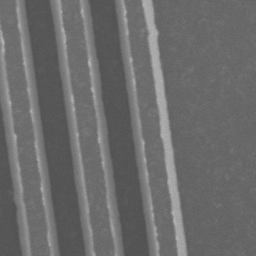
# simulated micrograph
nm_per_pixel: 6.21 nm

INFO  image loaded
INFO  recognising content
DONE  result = one or a few lines or trenches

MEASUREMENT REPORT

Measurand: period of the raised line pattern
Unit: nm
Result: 392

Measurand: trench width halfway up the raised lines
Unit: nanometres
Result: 209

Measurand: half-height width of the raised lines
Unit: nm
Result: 180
